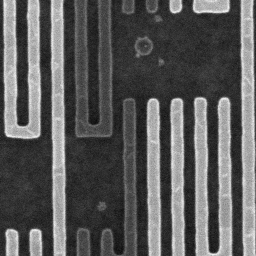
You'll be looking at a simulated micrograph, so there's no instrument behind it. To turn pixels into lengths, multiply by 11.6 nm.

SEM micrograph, wiring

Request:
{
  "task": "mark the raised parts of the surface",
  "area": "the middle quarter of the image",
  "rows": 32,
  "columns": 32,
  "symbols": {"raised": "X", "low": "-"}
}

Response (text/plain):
---XXX---XXX--------------------
---XXX---XXX--------------------
---XXX---XXX--------------------
---XXX---XXX--------------------
---XXX---XXX--------------------
---XXX---XXX--------------------
---XXX---XXX--------------------
---XXX---XXX--------------------
---XXX---XXX--------------------
---XXX---XXX---XXX---XXX---XXX--
---XXX---XXX---XXX---XXX---XXX--
---XXX---XXX---XXX---XXX---XXX--
---XXX---XXX---XXX---XXX---XXX--
---XXX---XXX---XXX---XXX---XXX--
---XXX---XXX---XXX---XXX---XXX--
---XXXXXXXXX---XXX---XXX---XXX--
---XXXXXXXXX---XXX---XXX---XXX--
---XXXXXXXXX---XXX---XXX---XXX--
---------------XXX---XXX---XXX--
---------------XXX---XXX---XXX--
---------------XXX---XXX---XXX--
---------------XXX---XXX---XXX--
---------------XXX---XXX---XXX--
---------------XXX---XXX---XXX--
---------------XXX---XXX---XXX--
---------------XXX---XXX---XXX--
---------------XXX---XXX---XXX--
---------------XXX---XXX---XXX--
---------------XXX---XXX---XXX--
---------------XXX---XXX---XXX--
---------------XXX---XXX---XXX--
---------------XXX---XXX---XXX--